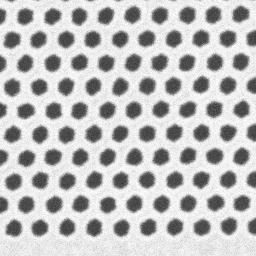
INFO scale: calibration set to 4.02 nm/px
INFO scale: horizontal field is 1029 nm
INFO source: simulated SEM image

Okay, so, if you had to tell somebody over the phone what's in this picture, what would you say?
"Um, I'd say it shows a regular array of holes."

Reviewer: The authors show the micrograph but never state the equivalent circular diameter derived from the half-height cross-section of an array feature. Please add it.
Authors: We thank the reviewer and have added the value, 68.1 nanometers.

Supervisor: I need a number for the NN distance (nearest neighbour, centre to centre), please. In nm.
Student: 106